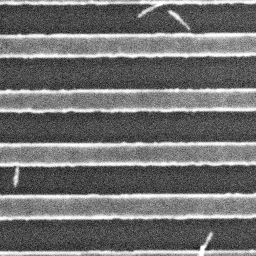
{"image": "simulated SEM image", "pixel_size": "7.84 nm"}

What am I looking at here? lines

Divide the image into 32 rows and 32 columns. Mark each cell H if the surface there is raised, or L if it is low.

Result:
LLLLLLLLLLLLLLLLLLLLLLLLLLLLLLLL
LLLLLLLLLLLLLLLLLLLLLLLLLLLLLLLL
LLLLLLLLLLLLLLLLLLLLLLLLLLLLLLLL
LLLLLLLLLLLLLLLLLLLLLLLLLLLLLLLL
HHHHHHHHHHHHHHHHHHHHHHHHHHHHHHHH
HHHHHHHHHHHHHHHHHHHHHHHHHHHHHHHH
HHHHHHHHHHHHHHHHHHHHHHHHHHHHHHHH
LLLLLLLLLLLLLLLLLLLLLLLLLLLLLLLL
LLLLLLLLLLLLLLLLLLLLLLLLLLLLLLLL
LLLLLLLLLLLLLLLLLLLLLLLLLLLLLLLL
LLLLLLLLLLLLLLLLLLLLLLLLLLLLLLLL
HHHHHHHHHHHHHHHHHHHHHHHHHHHHHHHH
HHHHHHHHHHHHHHHHHHHHHHHHHHHHHHHH
HHHHHHHHHHHHHHHHHHHHHHHHHHHHHHHH
LLLLLLLLLLLLLLLLLLLLLLLLLLLLLLLL
LLLLLLLLLLLLLLLLLLLLLLLLLLLLLLLL
LLLLLLLLLLLLLLLLLLLLLLLLLLLLLLLL
LLLLLLLLLLLLLLLLLLLLLLLLLLLLLLLL
HHHHHHHHHHHHHHHHHHHHHHHHHHHHHHHH
HHHHHHHHHHHHHHHHHHHHHHHHHHHHHHHH
HHHHHHHHHHHHHHHHHHHHHHHHHHHHLLHL
LLLLLLLLLLLLLLLLLLLLLLLLLLLLLLLL
LLLLLLLLLLLLLLLLLLLLLLLLLLLLLLLL
LLLLLLLLLLLLLLLLLLLLLLLLLLLLLLLL
HHHHHHHHHHHHHHHHHHHHHHHHHHHHHHHH
HHHHHHHHHHHHHHHHHHHHHHHHHHHHHHHH
HHHHHHHHHHHHHHHHHHHHHHHHHHHHHHHH
LLLLLLLLLLLLLLLLLLLLLLLLLLLLLLLL
LLLLLLLLLLLLLLLLLLLLLLLLLLLLLLLL
LLLLLLLLLLLLLLLLLLLLLLLLLLLLLLLL
LLLLLLLLLLLLLLLLLLLLLLLLLLLLLLLL
LLLLLLLLLLLHHHLLHHHHHHHHHHHHHHHH